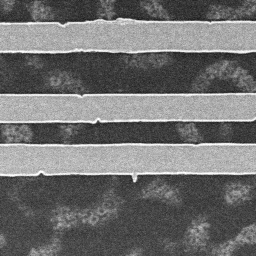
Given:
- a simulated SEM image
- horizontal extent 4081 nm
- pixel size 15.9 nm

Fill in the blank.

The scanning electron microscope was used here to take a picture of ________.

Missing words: one or a few lines or trenches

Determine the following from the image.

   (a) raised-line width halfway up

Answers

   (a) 464 nanometres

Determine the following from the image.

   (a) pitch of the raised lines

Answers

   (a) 977 nanometers